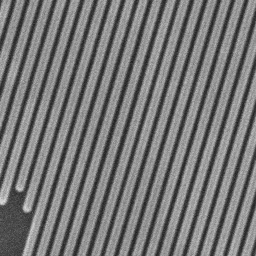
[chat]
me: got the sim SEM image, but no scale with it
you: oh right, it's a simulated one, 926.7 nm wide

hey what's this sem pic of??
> parallel lines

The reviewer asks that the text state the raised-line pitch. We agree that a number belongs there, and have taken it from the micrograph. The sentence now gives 47.5 nanometres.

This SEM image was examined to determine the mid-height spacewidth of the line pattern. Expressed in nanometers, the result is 22.6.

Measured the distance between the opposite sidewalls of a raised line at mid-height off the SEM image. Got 0.0256 microns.